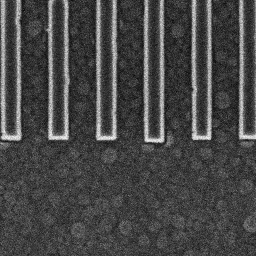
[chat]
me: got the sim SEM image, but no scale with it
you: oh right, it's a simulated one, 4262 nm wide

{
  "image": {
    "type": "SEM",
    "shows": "parallel lines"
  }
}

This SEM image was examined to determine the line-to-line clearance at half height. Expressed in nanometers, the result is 522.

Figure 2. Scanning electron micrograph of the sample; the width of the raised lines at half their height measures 268 nm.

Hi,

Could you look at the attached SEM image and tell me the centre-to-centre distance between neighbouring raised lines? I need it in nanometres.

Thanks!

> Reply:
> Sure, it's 796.